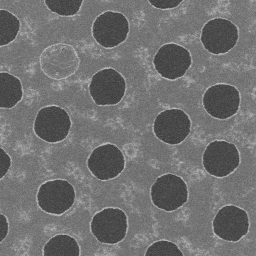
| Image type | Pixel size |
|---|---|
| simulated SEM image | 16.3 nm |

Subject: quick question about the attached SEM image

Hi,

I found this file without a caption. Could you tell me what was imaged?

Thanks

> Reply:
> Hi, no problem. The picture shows a regular array of holes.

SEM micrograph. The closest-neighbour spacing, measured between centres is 944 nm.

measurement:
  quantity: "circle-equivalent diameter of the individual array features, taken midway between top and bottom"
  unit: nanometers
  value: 599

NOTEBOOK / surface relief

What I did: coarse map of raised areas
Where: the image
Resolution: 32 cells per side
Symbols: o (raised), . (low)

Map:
oooooo....ooooooooo...oooooooooo
.oooooo...ooo.oooooooooooooooooo
..oooooooooo....oooooooooo..oooo
..oooooooooo....ooooooooo.....oo
..oooooooooo....ooooooooo.....oo
.oooooo.oooo...oooooo.ooo....ooo
ooooo....ooooooooooo....oo..oooo
ooooo.....ooooooooo.....oooooooo
ooooo.....ooooooooo.....oooooooo
..oooo...ooo...ooooo...ooooooooo
...oooooooo.....ooooooooooo.oooo
...oooooooo.....oooooooooo....oo
...ooooooooo...oooooooooo.....oo
ooooo...oooooooooooooooooo....oo
ooooo....ooooooooooo...ooo...ooo
oooo.....oooooooooo.....oooooooo
oooo.....oooooooooo.....oooooooo
oooooo..oooooooooooo...ooooooooo
oooooooooooo...ooooooooooo....oo
.oooooooooo....oooooooooo.....oo
.oooooooooo.....ooooooooo.....oo
.oooooooooo....ooooooooooo...ooo
ooooooo.oooooooooooo...ooooooooo
ooooo....oooooooooo....ooooooooo
ooooo....oooooooooo....ooooooooo
ooooo....oooooooooo....ooooooooo
oooooo..oooo...oooooooooooo....o
.oooooooooo.....ooooooooooo....o
.oooooooooo.....ooooooooooo....o
.oooooo..ooo....ooooooooooo...oo
oooooo....ooooooooo...oooooooooo
ooooo.....oooooooo.....ooooooooo